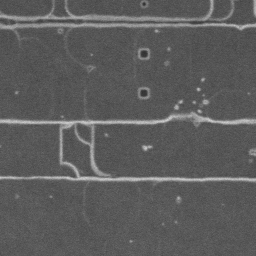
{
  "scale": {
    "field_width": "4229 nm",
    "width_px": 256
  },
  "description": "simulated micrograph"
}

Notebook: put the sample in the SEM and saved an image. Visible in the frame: wiring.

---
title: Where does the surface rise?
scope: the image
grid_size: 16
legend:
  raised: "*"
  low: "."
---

*************...
.*************..
****************
****************
****************
****************
****************
**********...***
................
................
................
****************
****************
****************
****************
****************